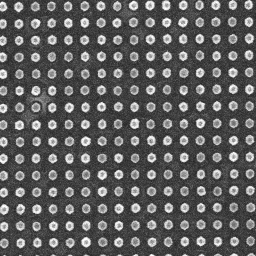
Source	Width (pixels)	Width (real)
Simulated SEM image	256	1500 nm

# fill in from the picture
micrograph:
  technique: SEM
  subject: a regular array of raised bodies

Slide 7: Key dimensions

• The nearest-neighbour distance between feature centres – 0.0944 µm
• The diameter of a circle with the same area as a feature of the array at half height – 49.1 nanometers